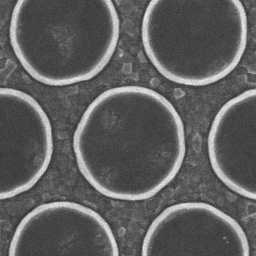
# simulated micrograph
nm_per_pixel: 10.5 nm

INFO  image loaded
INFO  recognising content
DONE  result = raised bodies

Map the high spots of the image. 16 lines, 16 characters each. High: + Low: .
.++++++..++++++.
.++++++..++++++.
.++++++..++++++.
.++++++..++++++.
..++++....++++..
................
++....++++....++
+++..++++++...++
+++..++++++..+++
+++..++++++..+++
+++..++++++...++
++....++++....++
................
..++++....++++..
.++++++..++++++.
.++++++..++++++.